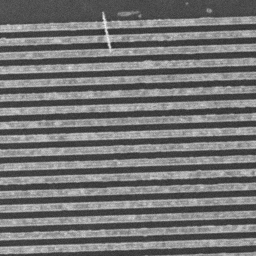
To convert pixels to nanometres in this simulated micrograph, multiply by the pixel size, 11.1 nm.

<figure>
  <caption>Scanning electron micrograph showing parallel lines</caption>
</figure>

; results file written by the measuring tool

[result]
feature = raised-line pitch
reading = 0.153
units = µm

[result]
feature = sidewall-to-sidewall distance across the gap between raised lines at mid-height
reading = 78.7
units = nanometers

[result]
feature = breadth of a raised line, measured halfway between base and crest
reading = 69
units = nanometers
